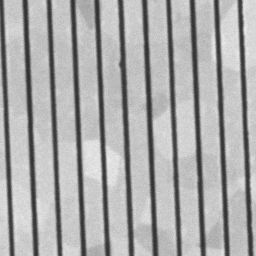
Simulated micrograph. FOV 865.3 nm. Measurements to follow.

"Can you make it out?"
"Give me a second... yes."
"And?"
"parallel lines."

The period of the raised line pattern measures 80.7 nm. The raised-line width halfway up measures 61.6 nm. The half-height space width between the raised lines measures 17.7 nm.